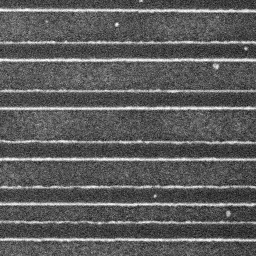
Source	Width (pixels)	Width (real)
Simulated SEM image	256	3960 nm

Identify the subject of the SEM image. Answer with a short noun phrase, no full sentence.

lines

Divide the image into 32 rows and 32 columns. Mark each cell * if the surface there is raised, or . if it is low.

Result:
********************************
................................
................................
................................
................................
********************************
********************************
.*........*..........*..*.......
................................
................................
................................
********************************
********************************
*..********...*...**..*.........
................................
................................
................................
................................
********************************
********************************
................................
................................
................................
********************************
********************************
********************************
................................
................................
********************************
********************************
................................
................................